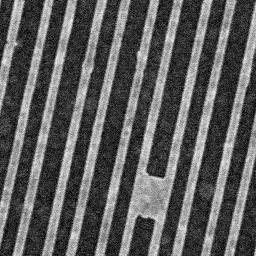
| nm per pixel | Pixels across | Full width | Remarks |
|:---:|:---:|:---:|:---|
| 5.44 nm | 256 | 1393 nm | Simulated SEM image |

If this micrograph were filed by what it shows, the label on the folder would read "parallel lines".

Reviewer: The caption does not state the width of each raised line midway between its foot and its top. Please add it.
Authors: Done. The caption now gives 42.6 nanometres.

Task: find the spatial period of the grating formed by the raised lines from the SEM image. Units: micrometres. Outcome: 0.141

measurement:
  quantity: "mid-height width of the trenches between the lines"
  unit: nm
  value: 89.1